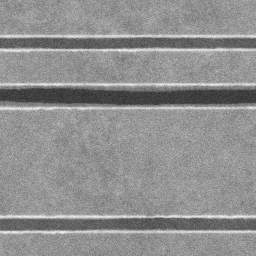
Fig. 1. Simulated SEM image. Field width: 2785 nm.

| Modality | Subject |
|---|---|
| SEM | lines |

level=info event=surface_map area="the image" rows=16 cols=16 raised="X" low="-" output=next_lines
XXXXXXXXXXXXXXXX
XXXXXXXXXXXXXXXX
XXXXXXXXXXXXXXXX
XXXXXXXXXXXXXXXX
XXXXXXXXXXXXXXXX
----------------
----------------
XXXXXXXXXXXXXXXX
XXXXXXXXXXXXXXXX
XXXXXXXXXXXXXXXX
XXXXXXXXXXXXXXXX
XXXXXXXXXXXXXXXX
XXXXXXXXXXXXXXXX
XXXXXXXXXXXXXXXX
XXXXXXXXXXXXXXXX
XXXXXXXXXXXXXXXX